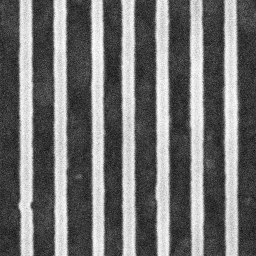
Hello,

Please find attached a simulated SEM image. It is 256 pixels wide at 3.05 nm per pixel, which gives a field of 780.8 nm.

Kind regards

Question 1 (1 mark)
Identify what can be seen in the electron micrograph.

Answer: parallel lines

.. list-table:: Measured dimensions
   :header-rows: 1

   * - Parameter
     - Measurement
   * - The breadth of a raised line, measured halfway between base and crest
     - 11.5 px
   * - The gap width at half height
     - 70.3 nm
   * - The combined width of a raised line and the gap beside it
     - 104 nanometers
